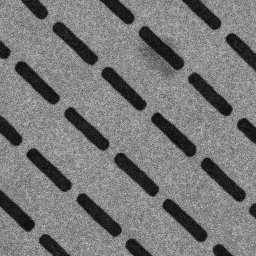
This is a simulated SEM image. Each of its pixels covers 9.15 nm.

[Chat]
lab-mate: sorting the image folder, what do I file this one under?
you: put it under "a regular array of holes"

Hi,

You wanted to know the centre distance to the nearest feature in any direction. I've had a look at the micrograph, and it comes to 501 nanometres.